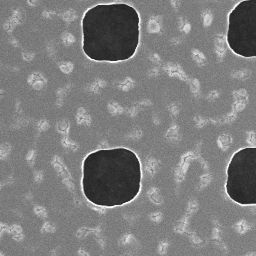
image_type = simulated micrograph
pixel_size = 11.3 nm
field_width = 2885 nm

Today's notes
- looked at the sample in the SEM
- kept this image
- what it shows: holes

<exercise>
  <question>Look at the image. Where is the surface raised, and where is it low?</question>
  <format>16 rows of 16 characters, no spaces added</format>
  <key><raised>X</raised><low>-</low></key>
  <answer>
XXXXXX--XXXXXXX-
XXXXX----XXXXX--
XXXXX----XXXXX--
XXXXXX--XXXXXXX-
XXXXXXXXXXXXXXXX
XXXXXXXXXXXXXXXX
XXXXXXXXXXXXXXXX
XXXXXXXXXXXXXXXX
XXXXXXXXXXXXXXXX
XXXXXX--XXXXXXX-
XXXXX----XXXXX--
XXXXX----XXXXX--
XXXXXX--XXXXXXX-
XXXXXXXXXXXXXXXX
XXXXXXXXXXXXXXXX
XXXXXXXXXXXXXXXX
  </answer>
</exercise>